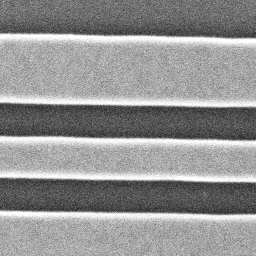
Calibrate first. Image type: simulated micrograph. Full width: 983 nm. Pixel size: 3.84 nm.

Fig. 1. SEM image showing wiring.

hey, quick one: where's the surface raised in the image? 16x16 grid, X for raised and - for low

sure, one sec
----------------
----------------
XXXXXXXXXXXXXXXX
XXXXXXXXXXXXXXXX
XXXXXXXXXXXXXXXX
XXXXXXXXXXXXXXXX
-------XXXXXXXXX
----------------
----------------
XXXXXXXXXXXXXXXX
XXXXXXXXXXXXXXXX
----------------
----------------
XXXXXXXXXXXXXXXX
XXXXXXXXXXXXXXXX
XXXXXXXXXXXXXXXX